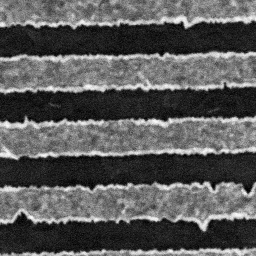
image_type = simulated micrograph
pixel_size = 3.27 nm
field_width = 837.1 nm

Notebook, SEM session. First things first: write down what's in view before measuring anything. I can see one or a few lines or trenches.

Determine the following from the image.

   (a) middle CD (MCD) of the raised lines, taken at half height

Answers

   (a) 111 nanometres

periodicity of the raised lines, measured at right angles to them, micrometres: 0.213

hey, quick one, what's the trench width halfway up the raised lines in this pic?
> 102 nanometres